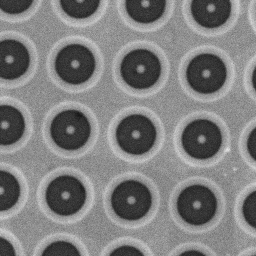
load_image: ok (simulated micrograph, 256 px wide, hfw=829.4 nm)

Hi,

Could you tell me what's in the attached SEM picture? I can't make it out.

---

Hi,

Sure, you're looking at an array of small figures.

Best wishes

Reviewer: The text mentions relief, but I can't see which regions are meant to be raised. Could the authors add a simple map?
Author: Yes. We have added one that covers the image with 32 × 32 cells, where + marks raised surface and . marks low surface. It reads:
....+++......++......++......+++
....++++....+++......++......+++
+++++++++..+++++....++++.....+++
+++++++++++++++++++++++++...++++
+.++++++++++++++++++++++++++++++
...+++++...+++++++++++++++++++++
....+++.....++++....+++++..+++++
....+++.....+++.....+++.....++++
....++......+++......++......++.
...++++.....+++.....+++......++.
++++++++...++++.....+++.....+++.
+++++++++++++++++.++++++....++++
++++++++++++++++++++++++++++++++
...+++++..++++++++++++++++++++++
...+++.....++++....++++++.++++++
....++......++......+++....+++++
...+++......++......++......+++.
...+++.....+++......++......+++.
.++++++....++++....+++......++..
++++++++++++++++..+++++....++++.
++++++++++++++++++++++++++++++++
..++++++.+++++++++++++++++++++++
...+++....+++++...++++++++++++++
...++......+++.....++++....+++++
...++......+++.....+++.....+++..
..+++......++......+++......++..
.+++++....++++.....+++.....+++..
+++++++++++++++...++++.....+++..
++++++++++++++++++++++++.++++++.
.+++++++++++++++++++++++++++++++
..++++....+++++..+++++++++++++++
..+++.....+++.....++++....++++++